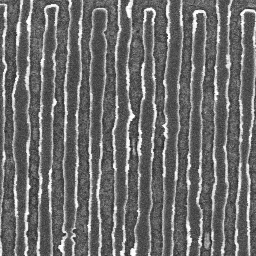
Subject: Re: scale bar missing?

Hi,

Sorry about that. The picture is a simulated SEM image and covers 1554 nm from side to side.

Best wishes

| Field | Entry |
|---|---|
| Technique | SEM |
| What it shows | parallel lines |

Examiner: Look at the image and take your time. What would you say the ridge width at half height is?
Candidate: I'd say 79.6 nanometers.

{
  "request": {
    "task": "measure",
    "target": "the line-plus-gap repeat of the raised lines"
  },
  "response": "0.151 micrometres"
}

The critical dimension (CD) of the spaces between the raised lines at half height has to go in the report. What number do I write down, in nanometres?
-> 68.2